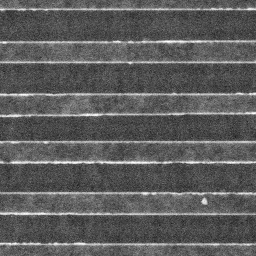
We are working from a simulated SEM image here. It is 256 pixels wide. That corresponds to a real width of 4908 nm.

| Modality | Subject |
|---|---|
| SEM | lines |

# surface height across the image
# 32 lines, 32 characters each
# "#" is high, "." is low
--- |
################################
................................
................................
................................
................................
################################
################################
################################
................................
................................
................................
................................
################################
################################
###.............................
................................
................................
................................
################################
################################
................................
................................
................................
................................
################################
################################
################################
................................
................................
................................
#####.#####.....................
################################